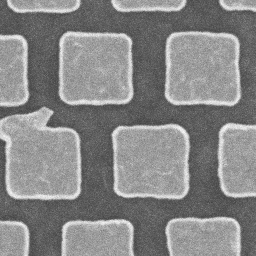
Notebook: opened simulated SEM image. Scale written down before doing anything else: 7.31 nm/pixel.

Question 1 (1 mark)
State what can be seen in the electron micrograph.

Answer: raised bodies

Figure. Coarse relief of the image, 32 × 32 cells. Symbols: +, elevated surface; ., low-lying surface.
.+++++++++....+++++++++.....++++
................................
................................
................................
........++++++++......+++++++...
+++.....++++++++.....+++++++++..
+++.....++++++++.....+++++++++..
+++.....++++++++.....+++++++++..
+++.....++++++++.....+++++++++..
+++.....++++++++.....+++++++++..
+++.....++++++++.....+++++++++..
+++.....++++++++.....+++++++++..
+++.....++++++++.....+++++++++..
................................
..++++..........................
++++++..........................
+++++++++.....+++++++++.....++++
.+++++++++....++++++++++....++++
.+++++++++....++++++++++...+++++
.+++++++++....+++++++++.....++++
.+++++++++....+++++++++.....++++
.+++++++++....+++++++++.....++++
.+++++++++....+++++++++.....++++
.+++++++++....+++++++++.....++++
..+++++++......++..++++.........
................................
................................
......................+++++++...
+++.....+++++++++....+++++++++..
+++.....+++++++++....+++++++++..
+++.....++++++++.....+++++++++..
+++.....++++++++.....+++++++++..